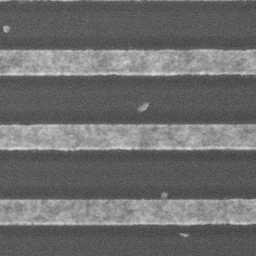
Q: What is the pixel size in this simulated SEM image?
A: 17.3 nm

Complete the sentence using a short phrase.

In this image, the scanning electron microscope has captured lines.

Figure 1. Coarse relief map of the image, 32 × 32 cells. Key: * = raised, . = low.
................................
................................
................................
................................
................................
................................
********************************
********************************
********************************
................................
................................
................................
................................
................................
................................
................................
********************************
********************************
********************************
................................
................................
................................
................................
................................
................................
********************************
********************************
********************************
................................
................................
................................
................................